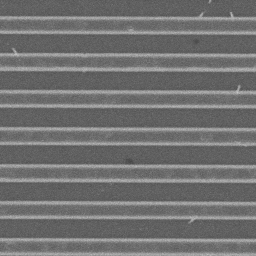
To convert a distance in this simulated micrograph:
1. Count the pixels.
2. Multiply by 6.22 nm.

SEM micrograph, parallel lines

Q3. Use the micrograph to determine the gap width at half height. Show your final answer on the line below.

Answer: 21.6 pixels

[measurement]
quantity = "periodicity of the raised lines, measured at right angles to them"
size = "230 nanometres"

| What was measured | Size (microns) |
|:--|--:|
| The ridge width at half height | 0.0941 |